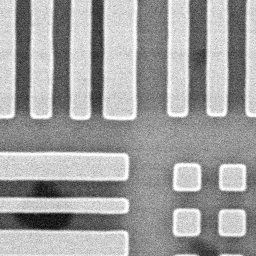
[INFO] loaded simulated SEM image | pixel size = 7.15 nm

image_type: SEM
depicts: groups of lines, slits or small figures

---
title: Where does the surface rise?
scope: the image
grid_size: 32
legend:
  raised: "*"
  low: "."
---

**..***..**..****....**...**...*
**..**...**..****....**...**...*
**..**...**..****....**...**...*
**..**...**..****....**...**...*
**..**...**..****....**...**...*
**..**...**..****....**...**...*
**..***..**..****....**...**...*
**..***..**..****....**...**...*
**..***..**..****....**...**...*
**..**...**..****....**...**...*
**..**...**..****....**...**...*
**..**...**..****....**...**...*
**..**...**..****....**...**...*
**..**...**..****....**...**...*
*...**...**..****...............
................................
................................
................................
................................
****************................
****************................
****************......***...***.
......................***...***.
......................***...**..
................................
****************................
...........*****......***...**..
......................***..****.
......................***..****.
****************................
****************................
****************................